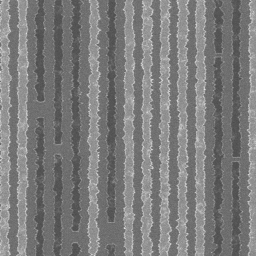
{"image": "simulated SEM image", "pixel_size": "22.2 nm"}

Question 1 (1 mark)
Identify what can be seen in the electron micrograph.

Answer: parallel lines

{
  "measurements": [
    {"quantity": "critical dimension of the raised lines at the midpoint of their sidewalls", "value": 0.186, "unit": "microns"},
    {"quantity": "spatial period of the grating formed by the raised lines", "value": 395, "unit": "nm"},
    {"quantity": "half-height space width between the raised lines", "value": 210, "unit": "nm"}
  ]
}